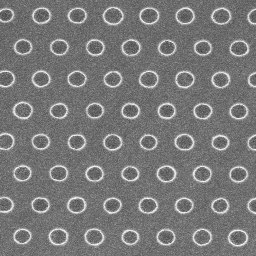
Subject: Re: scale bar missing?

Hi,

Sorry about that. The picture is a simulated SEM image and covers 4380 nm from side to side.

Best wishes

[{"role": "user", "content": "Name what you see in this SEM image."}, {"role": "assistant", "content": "a regular array of holes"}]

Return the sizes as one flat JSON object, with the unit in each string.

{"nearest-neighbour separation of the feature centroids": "0.613 microns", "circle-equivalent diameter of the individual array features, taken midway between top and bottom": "257 nanometres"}